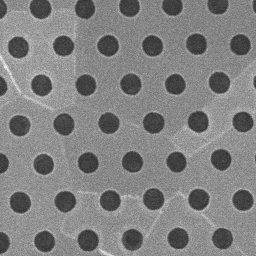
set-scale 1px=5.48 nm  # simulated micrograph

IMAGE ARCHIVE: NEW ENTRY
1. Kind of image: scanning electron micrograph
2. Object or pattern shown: a regular array of holes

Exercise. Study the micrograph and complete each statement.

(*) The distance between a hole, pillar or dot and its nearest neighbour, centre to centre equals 240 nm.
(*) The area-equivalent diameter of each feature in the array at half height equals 121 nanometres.